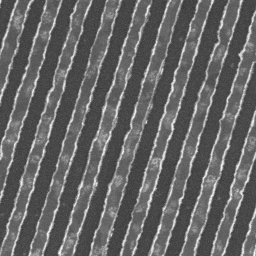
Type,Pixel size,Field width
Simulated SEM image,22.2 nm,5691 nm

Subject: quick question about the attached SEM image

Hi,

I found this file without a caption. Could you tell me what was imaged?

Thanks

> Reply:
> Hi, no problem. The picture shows parallel lines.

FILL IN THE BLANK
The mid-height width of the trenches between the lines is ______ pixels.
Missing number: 16.4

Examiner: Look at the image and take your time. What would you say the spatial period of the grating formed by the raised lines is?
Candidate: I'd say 643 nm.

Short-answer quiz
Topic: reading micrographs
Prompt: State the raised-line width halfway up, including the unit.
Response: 12.8 pixels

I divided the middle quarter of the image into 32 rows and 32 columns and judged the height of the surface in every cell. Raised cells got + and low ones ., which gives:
+.....+++.....+++....+++.....+++
+.....+++....+++.....+++....+++.
+....++++....+++.....+++....+++.
.....+++.....+++....+++.....+++.
.....+++.....+++....+++....++++.
....++++....+++.....+++....+++..
....+++.....+++....++++....+++..
....+++....++++....+++.....+++..
....+++....+++.....+++....+++...
...+++.....+++....++++....+++...
...+++....++++....+++....++++...
...+++....+++.....+++....++++...
..+++.....+++.....+++....+++....
..+++.....+++....+++.....+++....
..+++....+++.....+++....+++.....
.++++....+++.....+++....+++.....
.+++.....+++.....+++....+++....+
.+++.....+++....+++.....+++....+
+++.....+++....++++....+++.....+
+++....++++....++++....+++....++
+++....+++.....+++.....+++....++
+++....+++.....+++....+++.....++
++....++++....++++....+++.....++
++....+++.....+++.....+++....+++
++....+++.....+++....+++.....+++
+.....+++....+++.....+++....++++
+.....+++....+++.....+++....+++.
+....+++.....+++....++++....+++.
.....+++....++++....+++.....+++.
.....+++....++++....+++....+++..
....+++.....+++.....+++....+++..
....+++....++++....++++....+++..